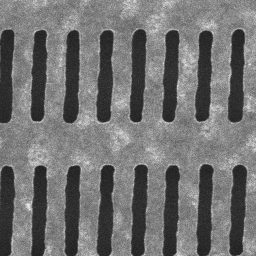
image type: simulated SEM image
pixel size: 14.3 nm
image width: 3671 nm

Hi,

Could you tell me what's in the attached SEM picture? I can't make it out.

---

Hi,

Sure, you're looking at holes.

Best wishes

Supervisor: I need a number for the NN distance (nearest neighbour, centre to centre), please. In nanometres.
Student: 471